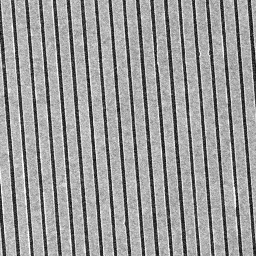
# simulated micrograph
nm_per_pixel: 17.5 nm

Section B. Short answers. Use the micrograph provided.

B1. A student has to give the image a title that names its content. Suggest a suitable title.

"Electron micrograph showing parallel lines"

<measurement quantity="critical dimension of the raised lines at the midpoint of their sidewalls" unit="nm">172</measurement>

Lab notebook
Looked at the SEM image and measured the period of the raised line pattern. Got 243 nm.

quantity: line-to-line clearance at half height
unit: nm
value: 65.4